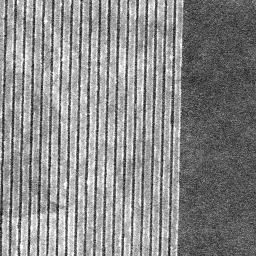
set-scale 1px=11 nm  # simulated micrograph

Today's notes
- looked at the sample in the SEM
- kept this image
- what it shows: parallel lines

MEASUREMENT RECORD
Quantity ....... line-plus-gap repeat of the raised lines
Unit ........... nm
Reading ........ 104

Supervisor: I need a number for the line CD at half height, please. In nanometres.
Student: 70.3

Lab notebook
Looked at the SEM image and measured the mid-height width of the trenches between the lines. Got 0.0331 um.